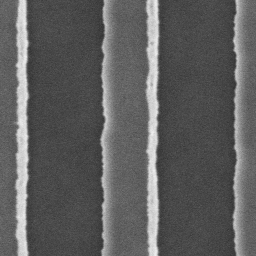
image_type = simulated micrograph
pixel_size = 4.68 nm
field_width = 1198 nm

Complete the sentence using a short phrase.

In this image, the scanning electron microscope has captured lines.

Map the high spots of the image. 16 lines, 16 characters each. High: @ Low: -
@@----@@@@-----@
@@-----@@@-----@
@@----@@@@-----@
@@----@@@@-----@
@@----@@@@-----@
@@----@@@@-----@
@@-----@@@-----@
@@-----@@@-----@
@@----@@@@-----@
@@----@@@@-----@
@@----@@@@-----@
@@----@@@@-----@
@@----@@@@-----@
@@----@@@@-----@
@@----@@@@-----@
@@----@@@@-----@